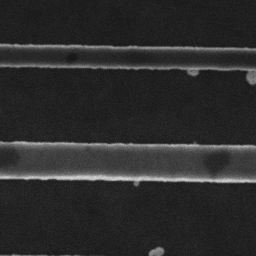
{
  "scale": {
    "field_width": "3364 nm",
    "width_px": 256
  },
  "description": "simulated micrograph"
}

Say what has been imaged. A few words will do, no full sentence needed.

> lines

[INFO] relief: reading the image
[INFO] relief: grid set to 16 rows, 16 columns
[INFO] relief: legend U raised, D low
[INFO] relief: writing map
DDDDDDDDDDDDDDDD
DDDDDDDDDDDDDDDD
DDDDDDDDDDDDDDDD
DDDDDDDDDDDDDDDD
DDDDDDDDDDDDDDDD
DDDDDDDDDDDDDDDD
DDDDDDDDDDDDDDDD
DDDDDDDDDDDDDDDD
DDDDDDDDDDDDDDDD
UUUUUUUUUUUUUUUU
UUUUUUUUUUUUUUUU
DDDDDDDDDDDDDDDD
DDDDDDDDDDDDDDDD
DDDDDDDDDDDDDDDD
DDDDDDDDDDDDDDDD
DDDDDDDDDDDDDDDD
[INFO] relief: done